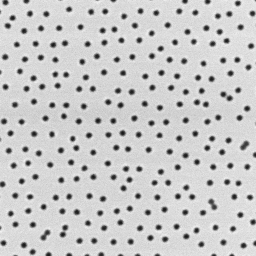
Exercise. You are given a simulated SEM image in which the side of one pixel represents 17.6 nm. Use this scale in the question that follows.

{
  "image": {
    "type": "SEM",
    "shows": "a regular array of holes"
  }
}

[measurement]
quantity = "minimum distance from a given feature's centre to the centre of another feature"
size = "248 nanometers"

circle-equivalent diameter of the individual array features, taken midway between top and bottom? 116 nanometers